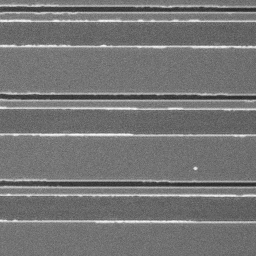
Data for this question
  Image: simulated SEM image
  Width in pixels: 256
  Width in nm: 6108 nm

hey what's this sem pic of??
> lines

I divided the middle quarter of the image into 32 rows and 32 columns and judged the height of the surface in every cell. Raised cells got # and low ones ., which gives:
################################
################################
################################
################################
################################
################################
################################
................................
................................
################################
################################
................................
................................
................................
................................
................................
................................
................................
################################
################################
################################
################################
################################
################################
################################
################################
################################
################################
################################
................................
................................
################################